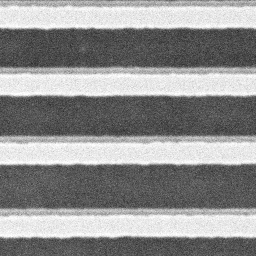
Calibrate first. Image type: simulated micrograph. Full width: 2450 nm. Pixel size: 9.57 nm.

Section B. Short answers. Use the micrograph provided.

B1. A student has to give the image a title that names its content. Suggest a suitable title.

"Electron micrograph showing lines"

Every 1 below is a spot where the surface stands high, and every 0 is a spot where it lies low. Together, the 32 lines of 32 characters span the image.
11111111111111111111111111111111
11111111111111111111111111111111
11111111111111111111111111111111
00000110000001100000110000010000
00000000000000000000000000000000
00000000000000000000000000000000
00000000000000000000000000000000
00000000000000000000000000000000
00000000000000000000000000000000
11111111111111111111111111111111
11111111111111111111111111111111
11111111111111111111111111111111
00000000000000000000000000000000
00000000000000000000000000000000
00000000000000000000000000000000
00000000000000000000000000000000
00000000000000000000000000000000
11111111111111111111111111111111
11111111111111111111111111111111
11111111111111111111111111111111
00000110100000000000000000000000
00000000000000000000000000000000
00000000000000000000000000000000
00000000000000000000000000000000
00000000000000000000000000000000
00000000000000000000000000000000
11111111111111111111111111111111
11111111111111111111111111111111
11111111111111111111111111111111
11111111101111100011100111111111
00000000000000000000000000000000
00000000000000000000000000000000